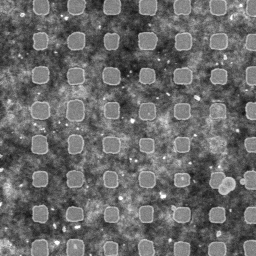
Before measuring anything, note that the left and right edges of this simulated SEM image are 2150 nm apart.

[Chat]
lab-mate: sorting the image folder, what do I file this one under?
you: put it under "a regular array of raised bodies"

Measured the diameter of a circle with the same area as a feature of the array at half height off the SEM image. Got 0.145 microns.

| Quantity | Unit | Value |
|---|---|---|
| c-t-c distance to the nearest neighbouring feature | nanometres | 288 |